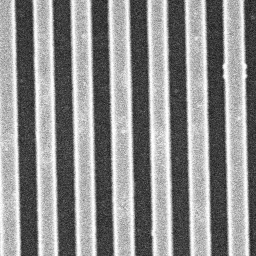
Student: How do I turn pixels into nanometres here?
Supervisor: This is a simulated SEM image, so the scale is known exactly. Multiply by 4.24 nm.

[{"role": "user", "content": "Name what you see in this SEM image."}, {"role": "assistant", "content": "parallel lines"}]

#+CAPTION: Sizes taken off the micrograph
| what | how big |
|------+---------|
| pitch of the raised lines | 0.162 µm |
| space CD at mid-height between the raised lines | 80.5 nm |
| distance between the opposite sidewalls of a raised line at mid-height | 19.9 pixels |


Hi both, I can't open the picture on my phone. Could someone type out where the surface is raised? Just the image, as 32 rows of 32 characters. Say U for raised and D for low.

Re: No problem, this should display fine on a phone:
UUDDUUUDDUUDDDUUDDDUUDDUUUDDUUDD
UUDDUUUDDUUDDDUUDDUUUDDUUUDDUUDD
UUDDUUUDDUUDDDUUDDUUUDDUUUDDUUDD
UUDDUUDDDUUDDDUUDDDUUDDUUUDDUUDD
UUDDUUUDDUUDDDUUDDDUUDDUUUDDUUDD
UUDDUUUDDUUDDDUUDDDUUDDUUUDDUUDD
UUDDUUUDDUUDDDUUDDDUUDDUUUDDUUDD
UUDDUUUDDUUDDDUUDDDUUDDUUUDDUUUD
UUDDUUUDDUUDDDUUDDDUUDDUUUDDUUUD
UUDDUUUDDUUDDDUUDDDUUDDUUUDDUUUD
UUDDUUUDDUUUDDUUDDDUUDDUUUDDUUUD
UUDDUUUDDUUUDDUUDDDUUDDUUUDDUUUD
UUDDDUUDDUUUDDUUDDDUUDDUUUDDUUUD
UUDDDUUDDUUUDDUUDDDUUDDUUUDDUUUD
UUDDDUUDDUUUDDUUDDDUUDDDUUDDUUUD
UUDDDUUDDUUUDDUUDDDUUDDDUUDDUUUD
UUDDDUUDDUUUDDUUDDDUUDDDUUDDUUUD
UUDDDUUDDUUUDDUUDDDUUDDDUUDDUUUD
UUDDDUUDDUUUDDUUDDDUUDDDUUDDUUUD
UUDDDUUDDUUUDDUUDDDUUDDDUUDDUUUD
UUDDDUUDDUUUDDUUDDDUUDDDUUDDUUUD
UUDDDUUDDUUUDDUUUDDUUDDDUUDDUUUD
UUDDDUUDDUUUDDUUUDDUUDDDUUDDUUUD
UUDDDUUDDUUUDDUUUDDUUDDDUUDDUUUD
UUDDDUUDDUUUDDUUUDDUUDDDUUDDUUUD
UUDDDUUDDDUUDDUUUDDUUDDDUUDDDUUD
UUDDDUUDDDUUDDUUUDDUUDDDUUDDDUUD
UUDDDUUDDDUUDDUUUDDUUDDDUUDDDUUD
UUDDDUUDDDUUDDUUUDDUUDDDUUDDDUUD
UUDDDUUDDDUUDDUUUDDUUDDDUUDDDUUD
UUDDDUUDDDUUDDUUUDDUUDDDUUDDDUUD
UUDDDUUDDDUUDDUUUDDUUDDDUUDDDUUD